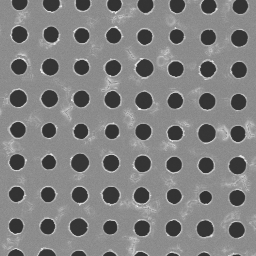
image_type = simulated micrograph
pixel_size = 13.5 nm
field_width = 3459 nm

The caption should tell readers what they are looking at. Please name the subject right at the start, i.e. a regular array of holes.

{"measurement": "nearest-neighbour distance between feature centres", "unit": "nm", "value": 422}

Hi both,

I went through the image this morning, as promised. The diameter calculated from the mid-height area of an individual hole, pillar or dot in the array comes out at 211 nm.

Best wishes